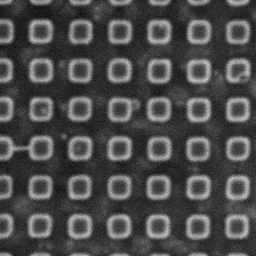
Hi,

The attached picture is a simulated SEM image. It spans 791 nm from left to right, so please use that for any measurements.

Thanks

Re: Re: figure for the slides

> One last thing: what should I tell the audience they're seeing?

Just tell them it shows a regular array of raised bodies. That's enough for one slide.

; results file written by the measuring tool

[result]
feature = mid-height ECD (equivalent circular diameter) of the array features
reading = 71.3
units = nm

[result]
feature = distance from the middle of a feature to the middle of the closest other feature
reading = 119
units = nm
